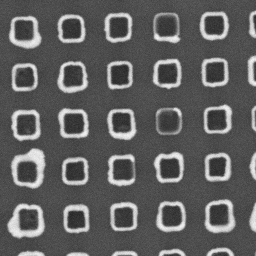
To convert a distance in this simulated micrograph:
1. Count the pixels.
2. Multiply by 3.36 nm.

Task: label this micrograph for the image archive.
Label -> a regular array of raised bodies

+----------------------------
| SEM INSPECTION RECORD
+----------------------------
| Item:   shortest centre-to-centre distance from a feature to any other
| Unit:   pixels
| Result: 46.3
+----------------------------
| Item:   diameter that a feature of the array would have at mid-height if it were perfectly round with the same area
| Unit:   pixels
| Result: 30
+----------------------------